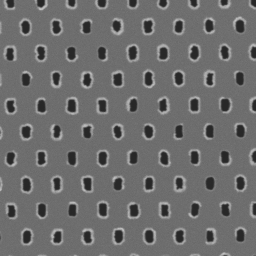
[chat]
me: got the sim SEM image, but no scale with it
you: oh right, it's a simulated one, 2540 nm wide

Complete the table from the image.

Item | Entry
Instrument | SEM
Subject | a regular array of holes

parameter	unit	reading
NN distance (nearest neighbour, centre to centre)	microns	0.296